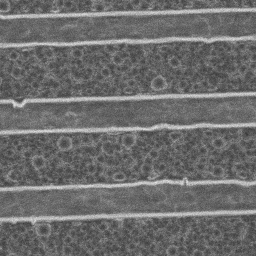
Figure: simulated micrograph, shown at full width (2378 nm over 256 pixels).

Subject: one or a few lines or trenches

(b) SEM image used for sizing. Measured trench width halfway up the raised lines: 280 nm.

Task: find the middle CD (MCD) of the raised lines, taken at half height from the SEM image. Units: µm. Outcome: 0.522